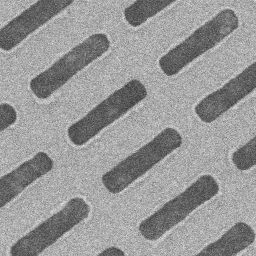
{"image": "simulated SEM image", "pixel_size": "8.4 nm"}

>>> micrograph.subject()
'holes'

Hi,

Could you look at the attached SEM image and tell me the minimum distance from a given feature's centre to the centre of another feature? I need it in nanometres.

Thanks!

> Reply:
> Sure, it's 504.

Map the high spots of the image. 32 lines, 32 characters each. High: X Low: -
XXXX-----XXXXXXX-----XXXXXXXXXXX
XXX-----XXXXXXXX----XXXXXXX--XXX
XX----XXXXXXXXXX--XXXXXXXX----XX
-----XXXXXXXXXXXXXXXXXXXX-----XX
---XXXXXXXX--XXXXXXXXXX-----XXXX
--XXXXXXXX----XXXXXXXX-----XXXXX
XXXXXXXXX----XXXXXXXX-----XXXXXX
XXXXXXX-----XXXXXXXX----XXXXXXXX
XXXXXX-----XXXXXXXXX---XXXXXXXX-
XXXXX----XXXXXXXXXXXXXXXXXXXXX--
XXXX----XXXXXXXX--XXXXXXXXXX----
XXXX---XXXXXXX----XXXXXXXXX----X
XXXXXXXXXXXXX-----XXXXXXX-----XX
--XXXXXXXXXX----XXXXXXXX-----XXX
--XXXXXXXXX----XXXXXXXXXX--XXXXX
--XXXXXXX-----XXXXXXXXXXXXXXXXXX
XXXXXXXX----XXXXXXXX--XXXXXXXXXX
XXXXXXXXX--XXXXXXXX----XXXXXXXX-
XXXXXXXXXXXXXXXXXX----XXXXXXXX--
XXXX--XXXXXXXXXX-----XXXXXXXX---
XXX----XXXXXXXX----XXXXXXXXXX---
X-----XXXXXXX-----XXXXXXXXXXXXXX
----XXXXXXXXX----XXXXXXX---XXXXX
---XXXXXXXXXX---XXXXXXX----XXXXX
--XXXXXXXXXXXXXXXXXXXX-----XXXXX
-XXXXXXX---XXXXXXXXX-----XXXXXXX
XXXXXXX----XXXXXXXX-----XXXXXXXX
XXXXXX----XXXXXXXX-----XXXXXXXXX
XXXX-----XXXXXXXX----XXXXXXXX--X
XXX-----XXXXXXXXXX--XXXXXXXX----
XX-----XXXXXXXXXXXXXXXXXXX-----X
X----XXXXXXXX--XXXXXXXXXX-----XX